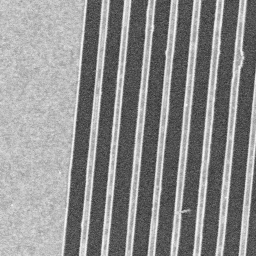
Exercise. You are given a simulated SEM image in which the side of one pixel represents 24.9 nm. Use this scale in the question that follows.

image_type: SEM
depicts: parallel lines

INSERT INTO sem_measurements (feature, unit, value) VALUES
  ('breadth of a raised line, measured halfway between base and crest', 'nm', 140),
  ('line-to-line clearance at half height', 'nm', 422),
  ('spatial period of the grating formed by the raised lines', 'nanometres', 565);